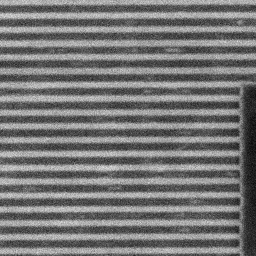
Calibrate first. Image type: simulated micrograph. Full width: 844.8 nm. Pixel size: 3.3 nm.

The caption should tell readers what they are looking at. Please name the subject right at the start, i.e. parallel lines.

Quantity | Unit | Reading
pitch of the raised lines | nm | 45.6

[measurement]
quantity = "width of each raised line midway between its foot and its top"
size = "15.7 nanometers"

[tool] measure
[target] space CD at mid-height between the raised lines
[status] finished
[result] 28 nanometres